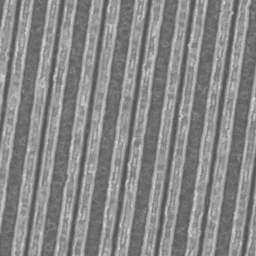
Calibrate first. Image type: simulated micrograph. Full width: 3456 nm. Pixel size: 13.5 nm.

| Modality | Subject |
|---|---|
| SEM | parallel lines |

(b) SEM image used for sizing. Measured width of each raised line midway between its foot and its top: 140 nanometres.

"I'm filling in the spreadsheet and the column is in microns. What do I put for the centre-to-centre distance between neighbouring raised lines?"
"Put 0.289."